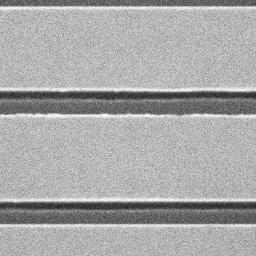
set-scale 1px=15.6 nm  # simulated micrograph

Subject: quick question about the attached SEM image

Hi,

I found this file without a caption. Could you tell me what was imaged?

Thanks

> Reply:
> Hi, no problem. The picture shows lines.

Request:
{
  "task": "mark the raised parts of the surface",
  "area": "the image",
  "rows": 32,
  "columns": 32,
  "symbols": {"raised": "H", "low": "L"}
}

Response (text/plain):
LLLLLLLLLLLLLLLLLLLLLLLLLLLLLLLL
HHHHHHHHHHHHHHHHHHHHHHHHHHHHHHHH
HHHHHHHHHHHHHHHHHHHHHHHHHHHHHHHH
HHHHHHHHHHHHHHHHHHHHHHHHHHHHHHHH
HHHHHHHHHHHHHHHHHHHHHHHHHHHHHHHH
HHHHHHHHHHHHHHHHHHHHHHHHHHHHHHHH
HHHHHHHHHHHHHHHHHHHHHHHHHHHHHHHH
HHHHHHHHHHHHHHHHHHHHHHHHHHHHHHHH
HHHHHHHHHHHHHHHHHHHHHHHHHHHHHHHH
HHHHHHHHHHHHHHHHHHHHHHHHHHHHHHHH
HHHHHHHHHHHHHHHHHHHHHHHHHHHHHHHH
LLLLLLLLLLLLLLLLLLLLLLLLLLLLLLLL
LLLLLLLLLLLLLLLLLLLLLLLLLLLLLLLL
LLLLLLLLLLLLLLLLLLLLLLLLLLLLLLLL
HHHHHHHHHHHHHHHHHHHHHHLHHHHHHLHH
HHHHHHHHHHHHHHHHHHHHHHHHHHHHHHHH
HHHHHHHHHHHHHHHHHHHHHHHHHHHHHHHH
HHHHHHHHHHHHHHHHHHHHHHHHHHHHHHHH
HHHHHHHHHHHHHHHHHHHHHHHHHHHHHHHH
HHHHHHHHHHHHHHHHHHHHHHHHHHHHHHHH
HHHHHHHHHHHHHHHHHHHHHHHHHHHHHHHH
HHHHHHHHHHHHHHHHHHHHHHHHHHHHHHHH
HHHHHHHHHHHHHHHHHHHHHHHHHHHHHHHH
HHHHHHHHHHHHHHHHHHHHHHHHHHHHHHHH
HHHHHHHHHHHHHHHHHHHHHHHHHHHHHHHH
LLLLLLLLLLLLLLLLLLLLLLLLLLLLLLLL
LLLLLLLLLLLLLLLLLLLLLLLLLLLLLLLL
LLLLLLLLLLLLLLLLLLLLLLLLLLLLLLLL
HHHHHHHHHHHHHHHHHHHHHHHHHHHHHHHH
HHHHHHHHHHHHHHHHHHHHHHHHHHHHHHHH
HHHHHHHHHHHHHHHHHHHHHHHHHHHHHHHH
HHHHHHHHHHHHHHHHHHHHHHHHHHHHHHHH